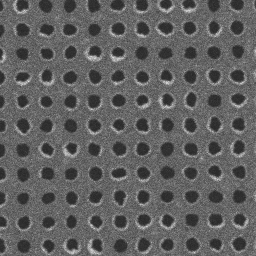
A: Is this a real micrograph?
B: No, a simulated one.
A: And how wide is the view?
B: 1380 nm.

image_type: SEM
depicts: a regular array of holes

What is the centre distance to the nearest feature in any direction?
125 nanometers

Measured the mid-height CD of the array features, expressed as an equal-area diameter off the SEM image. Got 0.0699 µm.